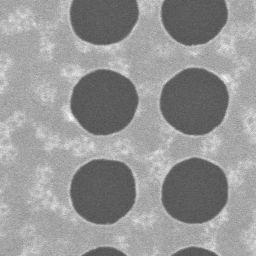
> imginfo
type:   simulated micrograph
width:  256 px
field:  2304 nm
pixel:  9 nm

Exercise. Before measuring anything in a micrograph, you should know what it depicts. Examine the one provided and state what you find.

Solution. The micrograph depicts holes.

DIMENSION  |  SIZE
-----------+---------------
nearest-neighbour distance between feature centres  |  804 nanometers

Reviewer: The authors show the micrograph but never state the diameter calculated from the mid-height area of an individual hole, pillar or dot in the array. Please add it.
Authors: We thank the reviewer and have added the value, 67.4 px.